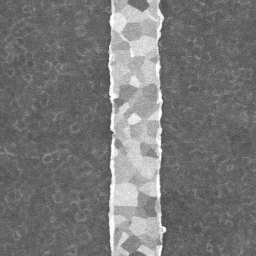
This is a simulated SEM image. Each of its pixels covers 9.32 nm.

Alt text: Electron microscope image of one or a few lines or trenches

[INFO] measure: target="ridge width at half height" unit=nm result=446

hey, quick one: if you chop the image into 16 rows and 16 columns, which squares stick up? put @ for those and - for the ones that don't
-------@@@------
-------@@@------
-------@@@------
-------@@@------
-------@@@------
-------@@@------
-------@@@------
-------@@@------
-------@@@------
-------@@@------
-------@@@------
-------@@@------
-------@@@------
-------@@@------
-------@@@------
-------@@@------